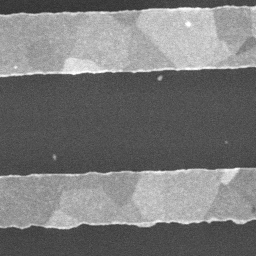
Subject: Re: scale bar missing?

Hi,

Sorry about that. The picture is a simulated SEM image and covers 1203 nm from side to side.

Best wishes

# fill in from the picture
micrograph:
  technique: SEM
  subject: lines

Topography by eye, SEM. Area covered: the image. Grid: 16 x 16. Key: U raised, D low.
DDDDDDDDDDDDDUUU
UUUUUUUUUUUUUUUU
UUUUUUUUUUUUUUUU
UUUUUUUUUUUUUUUU
UUUUUUUUUDDDDDDD
DDDDDDDDDDDDDDDD
DDDDDDDDDDDDDDDD
DDDDDDDDDDDDDDDD
DDDDDDDDDDDDDDDD
DDDDDDDDDDDDDDDD
DDDDDDDDDDDDDDDD
UUUUUUUUUUUUUUUU
UUUUUUUUUUUUUUUU
UUUUUUUUUUUUUUUU
DDDDDDDDDDDDDDDD
DDDDDDDDDDDDDDDD